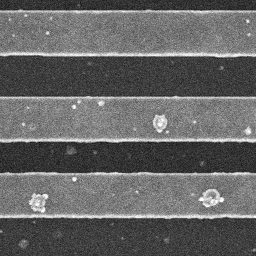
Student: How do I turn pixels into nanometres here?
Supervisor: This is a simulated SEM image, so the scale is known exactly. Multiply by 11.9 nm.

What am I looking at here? lines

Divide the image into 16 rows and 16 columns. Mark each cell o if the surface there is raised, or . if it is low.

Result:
................
oooooooooooooooo
oooooooooooooooo
.............oo.
................
................
oooooooooooooooo
oooooooooooooooo
oooooooooooooooo
................
................
oooooooooooooooo
oooooooooooooooo
oooooooooooooooo
................
................